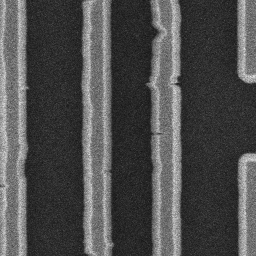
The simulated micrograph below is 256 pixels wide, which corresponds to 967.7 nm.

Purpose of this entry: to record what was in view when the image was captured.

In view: one or a few lines or trenches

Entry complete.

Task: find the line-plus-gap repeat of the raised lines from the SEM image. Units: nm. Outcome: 286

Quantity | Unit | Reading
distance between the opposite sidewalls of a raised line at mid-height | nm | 80.3